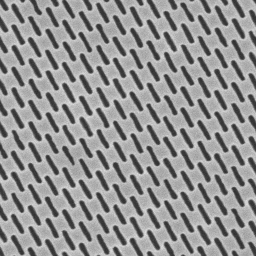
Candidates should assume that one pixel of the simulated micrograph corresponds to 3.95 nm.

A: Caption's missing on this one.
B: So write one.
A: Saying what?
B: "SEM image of a regular array of holes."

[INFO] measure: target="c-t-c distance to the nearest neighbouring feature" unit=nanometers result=74.3